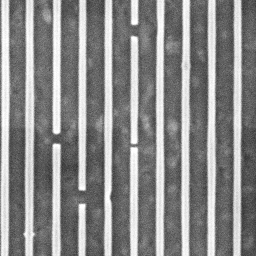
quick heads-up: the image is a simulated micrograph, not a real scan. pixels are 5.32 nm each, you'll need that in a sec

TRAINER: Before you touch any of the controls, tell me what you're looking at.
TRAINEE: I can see parallel lines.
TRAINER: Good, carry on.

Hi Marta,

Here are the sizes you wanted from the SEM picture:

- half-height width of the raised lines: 31.3 nm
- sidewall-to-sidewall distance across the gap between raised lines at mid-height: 0.104 um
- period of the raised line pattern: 137 nm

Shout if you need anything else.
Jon